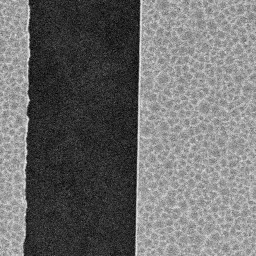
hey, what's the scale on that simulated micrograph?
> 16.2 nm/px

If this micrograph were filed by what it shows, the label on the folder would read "one or a few lines or trenches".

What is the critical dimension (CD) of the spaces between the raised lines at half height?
1.81 um